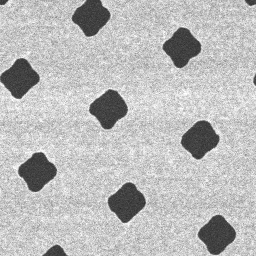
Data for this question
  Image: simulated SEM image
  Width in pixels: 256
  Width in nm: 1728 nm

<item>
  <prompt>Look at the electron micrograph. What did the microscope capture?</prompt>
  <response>holes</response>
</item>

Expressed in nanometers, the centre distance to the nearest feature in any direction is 638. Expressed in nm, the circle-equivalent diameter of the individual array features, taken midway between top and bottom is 240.